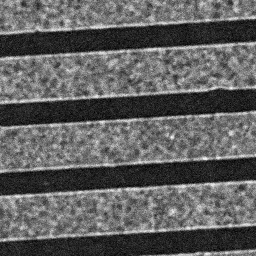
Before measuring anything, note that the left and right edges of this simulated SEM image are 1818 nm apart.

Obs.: one or a few lines or trenches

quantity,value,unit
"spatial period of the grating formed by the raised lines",488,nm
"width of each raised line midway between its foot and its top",308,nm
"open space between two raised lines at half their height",185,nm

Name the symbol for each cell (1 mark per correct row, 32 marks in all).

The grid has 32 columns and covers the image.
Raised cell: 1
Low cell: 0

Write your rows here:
11111111111111111111111111111111
11111111111111111111111111111111
11111111111111111111111111000000
11111111110000000000000000000000
00000000000000000000000000000000
00000000000000000000000000000001
00000000000000011111111111111111
11111111111111111111111111111111
11111111111111111111111111111111
11111111111111111111111111111111
11111111111111111111111111111111
11111111111111111111100000000000
11111000000000000000000000000000
00000000000000000000000000000000
00000000000000000000000000111111
00000000001111111111111111111111
11111111111111111111111111111111
11111111111111111111111111111111
11111111111111111111111111111111
11111111111111111111111111111100
11111111111111100000000000000000
00000000000000000000000000000000
00000000000000000000000000000000
00000000000000000000111111111111
00101111111111111111111111111111
11111111111111111111111111111111
11111111111111111111111111111111
11111111111111111111111111111111
11111111111111111111111100000000
11111111000000000000000000000000
00000000000000000000000000000000
00000000000000000000000000000011